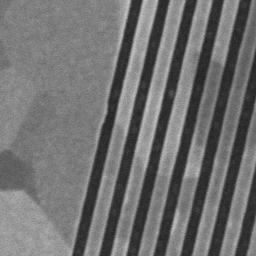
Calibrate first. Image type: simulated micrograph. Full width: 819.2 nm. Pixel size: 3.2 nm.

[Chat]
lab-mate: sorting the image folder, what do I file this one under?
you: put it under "parallel lines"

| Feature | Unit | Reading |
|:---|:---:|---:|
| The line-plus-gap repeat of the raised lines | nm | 84.5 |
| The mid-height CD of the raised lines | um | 0.0436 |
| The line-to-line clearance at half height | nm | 40.8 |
